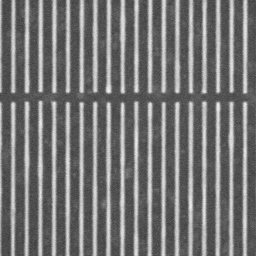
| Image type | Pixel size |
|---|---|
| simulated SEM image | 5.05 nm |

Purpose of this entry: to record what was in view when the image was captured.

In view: parallel lines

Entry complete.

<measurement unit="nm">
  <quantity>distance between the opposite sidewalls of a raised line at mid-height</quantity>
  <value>16.4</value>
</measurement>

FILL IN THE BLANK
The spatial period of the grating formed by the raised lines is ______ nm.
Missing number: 68.8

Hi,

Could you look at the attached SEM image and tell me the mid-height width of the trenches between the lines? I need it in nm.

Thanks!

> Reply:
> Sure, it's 52.4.